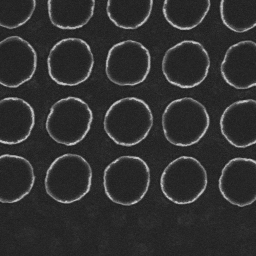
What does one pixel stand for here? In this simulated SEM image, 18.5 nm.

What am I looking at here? a regular array of raised bodies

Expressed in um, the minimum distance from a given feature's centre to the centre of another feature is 1.06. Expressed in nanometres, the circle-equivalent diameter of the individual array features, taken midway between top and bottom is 869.